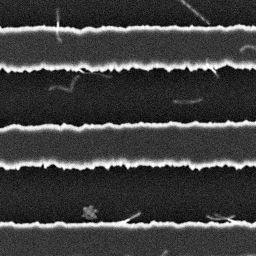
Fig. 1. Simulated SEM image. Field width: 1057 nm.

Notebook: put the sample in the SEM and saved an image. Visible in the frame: lines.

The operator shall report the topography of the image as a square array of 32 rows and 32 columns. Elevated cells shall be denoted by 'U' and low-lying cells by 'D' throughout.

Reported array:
DDDDDDDDDDDDDDDDDDDDDDDDDDDDDDDD
DDDDDDDDDDDDDDDDDDDDDDDDDDDDDDDD
DDDDDDDDDDDDDDDDDDDDDDDDDDDDDDDD
DDDUUUUUDDDDDUUDUUUUUUUUUUUUUUUU
UUUUUUUUUUUUUUUUUUUUUUUUUUUUUUUU
UUUUUUUUUUUUUUUUUUUUUUUUUUUUUUUU
UUUUUUUUUUUUUUUUUUUUUUUUUUUUUUUU
UUUUUUUUUUUUUUUUUUUUUUUUUUUUUUUU
UUUUUUUUUUUUUUUUDUUDUUUUUUUDDDUU
DDDDDDDDDDDDDDDDDDDDDDDDDDDDDDDD
DDDDDDDDDDDDDDDDDDDDDDDDDDDDDDDD
DDDDDDDDDDDDDDDDDDDDDDDDDDDDDDDD
DDDDDDDDDDDDDDDDDDDDDDDDDDDDDDDD
DDDDDDDDDDDDDDDDDDDDDDDDDDDDDDDD
DDDDDDDDDDDDDDDDDDDDDDDDDDDDDDDD
DDDDDDDDDDDDDUDDDUUDUUUUUUUUUUUU
UUUUUUUUUUUUUUUUUUUUUUUUUUUUUUUU
UUUUUUUUUUUUUUUUUUUUUUUUUUUUUUUU
UUUUUUUUUUUUUUUUUUUUUUUUUUUUUUUU
UUUUUUUUUUUUUUUUUUUUUUUUUUUUUUUU
UUUUUUUUUUUUUUUUUUUUUUUUUUUUUUUU
DDDDDDDDDDDDDDDDDDDDDDDDDDDDDDDD
DDDDDDDDDDDDDDDDDDDDDDDDDDDDDDDD
DDDDDDDDDDDDDDDDDDDDDDDDDDDDDDDD
DDDDDDDDDDDDDDDDDDDDDDDDDDDDDDDD
DDDDDDDDDDDDDDDDDDDDDDDDDDDDDDDD
DDDDDDDDDDDDDDDDDDDDDDDDDDDDDDDD
DDDDDDDDDDDDDDDDDDDDDDDDDDDDDDDD
UUUUUUUUUUUUUUUUUUUUUUUUUUUUUUUU
UUUUUUUUUUUUUUUUUUUUUUUUUUUUUUUU
UUUUUUUUUUUUUUUUUUUUUUUUUUUUUUUU
UUUUUUUUUUUUUUUUUUUUUUUUUUUUUUUU